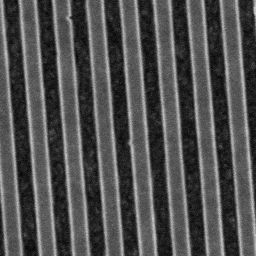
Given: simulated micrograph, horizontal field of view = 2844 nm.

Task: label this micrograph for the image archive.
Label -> parallel lines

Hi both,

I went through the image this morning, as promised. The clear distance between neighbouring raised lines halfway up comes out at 0.194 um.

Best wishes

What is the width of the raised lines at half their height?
184 nanometers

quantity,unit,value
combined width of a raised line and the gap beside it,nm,371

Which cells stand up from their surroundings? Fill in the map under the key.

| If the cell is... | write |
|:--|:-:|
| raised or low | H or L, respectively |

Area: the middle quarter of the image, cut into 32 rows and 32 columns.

HHHLLLLHHHHLLLLHHHHLLLLLHHHHLLLL
HHHLLLLHHHHLLLLLHHHLLLLLHHHHLLLL
HHHLLLLHHHHLLLLLHHHHLLLLHHHHLLLL
HHHLLLLHHHHLLLLLHHHHLLLLHHHHLLLL
HHHLLLLHHHHLLLLLHHHHLLLLHHHHLLLL
HHHLLLLLHHHHLLLLHHHHLLLLHHHHLLLL
HHHLLLLHHHHLLLLLHHHHLLLLHHHHLLLL
HHHLLLLHHHHLLLLLHHHHLLLLHHHHLLLL
HHHLLLLLHHHLLLLLHHHHLLLLHHHHLLLL
HHHLLLLLHHHHLLLLHHHHLLLLHHHHLLLL
HHHLLLLLHHHHLLLLHHHHLLLLLHHHLLLL
HHHLLLLLHHHHLLLLHHHHLLLLLHHHHLLL
HHHHLLLLHHHHLLLLHHHHLLLLLHHHHLLL
HHHHLLLLHHHHLLLLHHHHLLLLLHHHHLLL
HHHHLLLLHHHHLLLLLHHHHLLLLHHHHLLL
HHHHLLLLHHHHLLLLLHHHHLLLLHHHHLLL
HHHHLLLLHHHHLLLLLHHHHLLLLHHHHLLL
HHHHLLLLHHHHLLLLLHHHHLLLLHHHHLLL
HHHHLLLLHHHHLLLLLHHHHLLLLHHHHLLL
HHHHLLLLHHHHLLLLHHHHHLLLLHHHHLLL
HHHHLLLLHHHHLLLLLHHHHLLLLHHHHLLL
HHHHLLLLLHHHHLLLLHHHHLLLLHHHHLLL
HHHHLLLLLHHHHLLLLHHHHLLLLHHHHLLL
HHHHLLLLLHHHHLLLLHHHHLLLLLHHHLLL
HHHHLLLLLHHHHLLLLHHHHLLLLLHHHHLL
LHHHHLLLLHHHHLLLLHHHHLLLLLHHHHLL
LHHHHLLLLHHHHLLLLHHHHLLLLLHHHHLL
LHHHHLLLLHHHHLLLLLHHHLLLLLHHHHLL
LHHHHLLLLHHHHLLLLLHHHLLLLLHHHHLL
LHHHHLLLLHHHHLLLLLHHHHLLLLHHHHLL
LHHHHLLLLHHHHLLLLLHHHHLLLLHHHHLL
LHHHHLLLLHHHHHLLLLHHHHLLLLHHHHLL